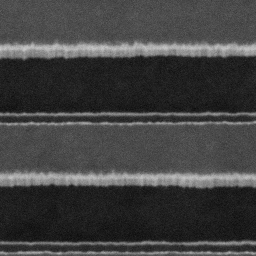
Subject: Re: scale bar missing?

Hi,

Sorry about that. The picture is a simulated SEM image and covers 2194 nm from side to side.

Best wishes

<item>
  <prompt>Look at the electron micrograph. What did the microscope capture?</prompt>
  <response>lines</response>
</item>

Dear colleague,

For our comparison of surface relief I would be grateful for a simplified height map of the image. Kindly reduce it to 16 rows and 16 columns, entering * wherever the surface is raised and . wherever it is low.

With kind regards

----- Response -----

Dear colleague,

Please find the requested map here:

****************
****************
****************
................
................
................
................
****************
****************
****************
****************
................
................
................
................
****************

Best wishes